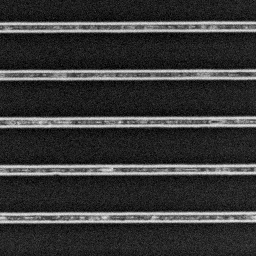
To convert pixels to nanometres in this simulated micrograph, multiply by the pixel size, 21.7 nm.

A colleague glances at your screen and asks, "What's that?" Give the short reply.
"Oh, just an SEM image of parallel lines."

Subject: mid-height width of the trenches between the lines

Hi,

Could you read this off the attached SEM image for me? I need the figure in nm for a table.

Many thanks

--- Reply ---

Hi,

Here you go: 869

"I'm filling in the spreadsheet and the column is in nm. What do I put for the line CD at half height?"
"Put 162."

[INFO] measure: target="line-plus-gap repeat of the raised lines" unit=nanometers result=1030